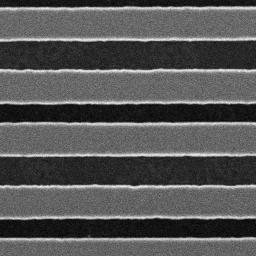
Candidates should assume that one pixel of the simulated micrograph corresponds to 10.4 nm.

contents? lines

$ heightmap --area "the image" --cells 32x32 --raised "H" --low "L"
LLLLLLLLLLLLLLLLLLLLLLLLLLLLLLLL
HHHHHHHHHHHHHHHHHHHHHHHHHHHHHHHH
HHHHHHHHHHHHHHHHHHHHHHHHHHHHHHHH
HHHHHHHHHHHHHHHHHHHHHHHHHHHHHHHH
HHHHHHHHHHHHHHHHHHHHHHHHHHHHHHHH
LLLLLLLLLLLLLLLLLLLLLLLLLLLLLLLL
LLLLLLLLLLLLLLLLLLLLLLLLLLLLLLLL
LLLLLLLLLLLLLLLLLLLLLLLLLLLLLLLL
LLLLLLLLLLLLLLLLLLLLLLLLLLLLLLLL
HHHHHHHHHHHHHHHHHHHHHHHHHHHHHHHH
HHHHHHHHHHHHHHHHHHHHHHHHHHHHHHHH
HHHHHHHHHHHHHHHHHHHHHHHHHHHHHHHH
HHHHHHHHHHHHHHHHHHHHHHHHHHHHHHHH
LLLLLLLLLLLLLLLLLLLLLLLLLLLLLLLL
LLLLLLLLLLLLLLLLLLLLLLLLLLLLLLLL
HHHHHHHHHHHHHHHHHHHHHHHHHHHHHHHH
HHHHHHHHHHHHHHHHHHHHHHHHHHHHHHHH
HHHHHHHHHHHHHHHHHHHHHHHHHHHHHHHH
HHHHHHHHHHHHHHHHHHHHHHHHHHHHHHHH
HHHHHHHHHHHHHHHHHHHHHHHLHHHHHHHL
LLLLLLLLLLLLLLLLLLLLLLLLLLLLLLLL
LLLLLLLLLLLLLLLLLLLLLLLLLLLLLLLL
LLLLLLLLLLLLLLLLLLLLLLLLLLLLLLLL
HHHHHHHHHHHHHHHHHHHHHHHHHHHHHHHH
HHHHHHHHHHHHHHHHHHHHHHHHHHHHHHHH
HHHHHHHHHHHHHHHHHHHHHHHHHHHHHHHH
HHHHHHHHHHHHHHHHHHHHHHHHHHHHHHHH
LLLLLLLLLLLLLLLLLLLLLLLLLLLLLLLL
LLLLLLLLLLLLLLLLLLLLLLLLLLLLLLLL
LLLLLLLLLLLLLLLLLLLLLLLLLLLLLLLL
HHHHHHHHHHHHHHHHHHHHHHHHHHHHHHHH
HHHHHHHHHHHHHHHHHHHHHHHHHHHHHHHH